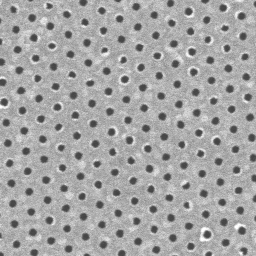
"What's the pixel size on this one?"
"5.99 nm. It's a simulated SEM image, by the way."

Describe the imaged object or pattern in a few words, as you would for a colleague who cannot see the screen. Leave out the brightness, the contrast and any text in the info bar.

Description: a regular array of holes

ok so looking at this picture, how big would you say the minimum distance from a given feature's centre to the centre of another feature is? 118 nm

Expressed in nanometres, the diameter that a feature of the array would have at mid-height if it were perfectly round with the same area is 46.8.